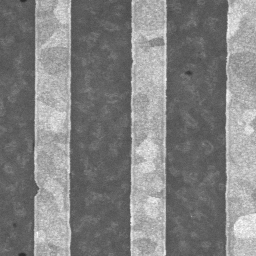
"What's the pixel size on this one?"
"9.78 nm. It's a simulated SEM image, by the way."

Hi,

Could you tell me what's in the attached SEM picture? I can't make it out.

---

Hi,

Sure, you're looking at one or a few lines or trenches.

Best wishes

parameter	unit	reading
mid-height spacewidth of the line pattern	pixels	62.1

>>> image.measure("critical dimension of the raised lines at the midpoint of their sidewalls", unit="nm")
331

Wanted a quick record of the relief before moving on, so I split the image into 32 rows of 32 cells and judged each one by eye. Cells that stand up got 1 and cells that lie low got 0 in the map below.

00000111100000000111100000000111
00001111100000000111100000000111
00001111100000000111100000000111
00001111100000000111100000000111
00000111100000000111100000001111
00000111100000000111100000001111
00000111100000000111100000000111
00000111100000000111100000001111
00000111100000000111100000001111
00000111100000000111100000001111
00000111100000000111100000001111
00000111100000000111100000001111
00000111100000000111100000001111
00000111100000000111100000001111
00001111100000000111100000001111
00001111100000000111100000001111
00001111100000000111100000001111
00000111100000000111100000001111
00001111100000000111100000001111
00001111100000001111100000001111
00001111100000001111000000001111
00001111100000001111100000001111
00001111100000001111100000001111
00000111100000001111100000001111
00000111000000001111100000001111
00001111100000001111100000001111
00001111100000001111100000001111
00001111100000001111100000001111
00001111100000001111100000001111
00001111100000001111100000001111
00001111100000001111100000001111
00001111100000001111100000001111